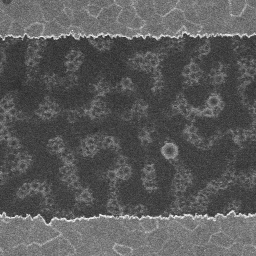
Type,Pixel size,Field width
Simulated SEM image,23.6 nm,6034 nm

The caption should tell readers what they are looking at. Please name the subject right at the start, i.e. one or a few lines or trenches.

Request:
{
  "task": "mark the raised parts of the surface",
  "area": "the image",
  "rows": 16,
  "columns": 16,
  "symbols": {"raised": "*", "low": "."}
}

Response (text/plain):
****************
****************
................
................
................
................
................
................
................
..........*.....
................
................
................
...........*****
****************
****************